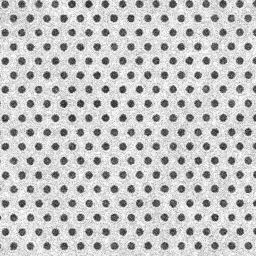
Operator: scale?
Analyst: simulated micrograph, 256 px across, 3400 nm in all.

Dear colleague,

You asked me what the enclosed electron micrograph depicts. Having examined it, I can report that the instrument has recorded a regular array of holes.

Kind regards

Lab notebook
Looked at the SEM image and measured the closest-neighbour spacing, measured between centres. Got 216 nanometers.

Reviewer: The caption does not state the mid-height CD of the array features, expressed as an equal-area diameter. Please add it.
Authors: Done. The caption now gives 125 nanometres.